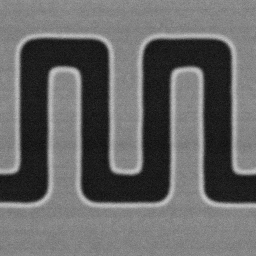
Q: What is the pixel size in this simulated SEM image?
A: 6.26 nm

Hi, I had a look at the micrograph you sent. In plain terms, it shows groups of lines, slits or small figures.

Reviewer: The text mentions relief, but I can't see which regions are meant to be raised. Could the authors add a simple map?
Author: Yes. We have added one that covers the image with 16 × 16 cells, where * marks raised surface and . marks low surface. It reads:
****************
****************
**....***.....**
*......**......*
*..**..**..*...*
*..**..**..**..*
*..**..**..**..*
*..**..**..**..*
*..**..**..**..*
*..**..**..**..*
*..**..**..**..*
...**......**...
...**.....***...
****************
****************
****************